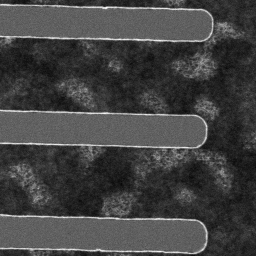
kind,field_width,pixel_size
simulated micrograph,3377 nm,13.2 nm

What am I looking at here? one or a few lines or trenches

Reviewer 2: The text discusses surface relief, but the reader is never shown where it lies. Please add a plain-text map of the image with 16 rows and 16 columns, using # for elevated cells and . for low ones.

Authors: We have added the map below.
........########
.............###
########.....###
################
################
################
################
.............###
.............###
################
################
################
################
.###############
.............###
.............###